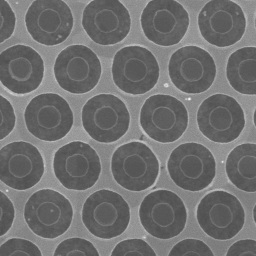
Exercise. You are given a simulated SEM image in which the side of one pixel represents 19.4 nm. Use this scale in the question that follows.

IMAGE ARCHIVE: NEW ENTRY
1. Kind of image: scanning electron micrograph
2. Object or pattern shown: a regular array of ring-shaped grooves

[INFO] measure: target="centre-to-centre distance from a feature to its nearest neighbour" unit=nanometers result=1080